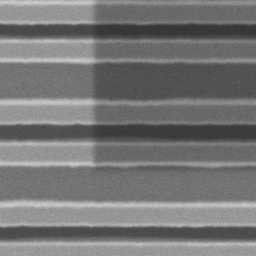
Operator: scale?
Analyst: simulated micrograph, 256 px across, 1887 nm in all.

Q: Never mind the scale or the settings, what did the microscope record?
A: lines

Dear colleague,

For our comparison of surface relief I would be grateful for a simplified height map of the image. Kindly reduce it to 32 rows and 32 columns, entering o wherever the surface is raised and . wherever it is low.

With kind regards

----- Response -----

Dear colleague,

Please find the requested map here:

oooooooooooooooooooooooooooooooo
oooooooooooooooooooooooooooooooo
oooooooooooooooooooooooooooooooo
................................
................................
oooooooooooooooooooooooooooooooo
oooooooooooooooooooooooooooooooo
oooooooooooooooooooooooooooooooo
................................
................................
................................
................................
................................
oooooooooooooooooooooooooooooooo
oooooooooooooooooooooooooooooooo
................................
................................
................................
oooooooooooooooooooooooooooooooo
oooooooooooooooooooooooooooooooo
.ooooooooooooooooooooooooooooooo
................................
................................
................................
................................
................................
oooooooooooooooooooooooooooooooo
oooooooooooooooooooooooooooooooo
................................
................................
oooooooooooooooooooooooooooooooo
oooooooooooooooooooooooooooooooo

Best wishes